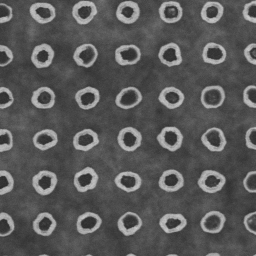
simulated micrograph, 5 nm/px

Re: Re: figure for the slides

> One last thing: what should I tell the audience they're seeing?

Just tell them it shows a regular array of raised bodies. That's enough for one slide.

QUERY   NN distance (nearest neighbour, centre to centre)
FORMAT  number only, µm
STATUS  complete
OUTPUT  0.205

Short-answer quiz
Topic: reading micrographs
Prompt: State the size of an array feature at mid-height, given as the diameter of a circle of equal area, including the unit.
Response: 0.107 um